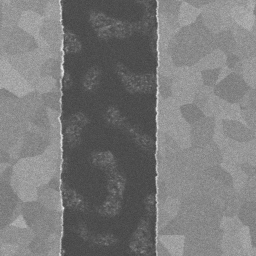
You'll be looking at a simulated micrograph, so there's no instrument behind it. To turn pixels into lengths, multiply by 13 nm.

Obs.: one or a few lines or trenches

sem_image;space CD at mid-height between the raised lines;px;95.8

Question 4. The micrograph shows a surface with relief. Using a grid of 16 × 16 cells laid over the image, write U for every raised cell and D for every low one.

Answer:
UUUUDDDDDDUUUUUU
UUUUDDDDDDUUUUUU
UUUUDDDDDDUUUUUU
UUUUDDDDDDUUUUUU
UUUUDDDDDDUUUUUU
UUUUDDDDDDUUUUUU
UUUUDDDDDDUUUUUU
UUUUDDDDDDUUUUUU
UUUUDDDDDDUUUUUU
UUUUDDDDDDUUUUUU
UUUUDDDDDDUUUUUU
UUUUDDDDDDUUUUUU
UUUUDDDDDDUUUUUU
UUUUDDDDDDUUUUUU
UUUUDDDDDDUUUUUU
UUUUDDDDDDUUUUUU